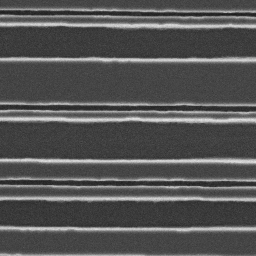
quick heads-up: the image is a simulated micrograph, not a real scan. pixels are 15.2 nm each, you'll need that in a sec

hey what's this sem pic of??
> lines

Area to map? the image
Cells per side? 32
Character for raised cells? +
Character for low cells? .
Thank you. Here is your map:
++++++++++++++++++++++++++++++++
++++++++++++++++++++++++++++++++
++++++++++++++++++++++++++++++++
................................
................................
................................
................................
................................
++++++++++++++++++++++++++++++++
++++++++++++++++++++++++++++++++
++++++++++++++++++++++++++++++++
++++++++++++++++++++++++++++++++
++++++++++++++++++++++++++++++++
++++++++++++++++++++++++++++++++
++++++++++++++++++++++++++++++++
................................
................................
................................
................................
................................
++++++++++++++++++++++++++++++++
++++++++++++++++++++++++++++++++
++++++++++++++++++++++++++++++++
++++++++++++++++++++++++++++++++
++++++++++++++++++++++++++++++++
................................
................................
................................
................................
++++++++++++++++++++++++++++++++
++++++++++++++++++++++++++++++++
++++++++++++++++++++++++++++++++